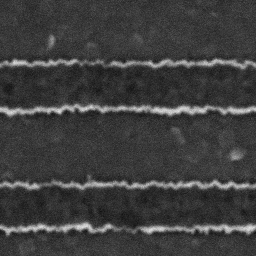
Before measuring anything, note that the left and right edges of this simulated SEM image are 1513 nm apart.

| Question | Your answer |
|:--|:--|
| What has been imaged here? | one or a few lines or trenches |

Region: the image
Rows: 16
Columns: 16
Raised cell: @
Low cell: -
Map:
----------------
----------------
----------------
----------------
@@@@@@@@@@@@@@@@
@@@@@@@@@@@@@@@@
@@@@@@@@@@@@@@@@
----------------
----------------
----------------
----------------
@@-@@@@@-@@@@@@-
@@@@@@@@@@@@@@@@
@@@@@@@@@@@@@@@@
----------------
----------------